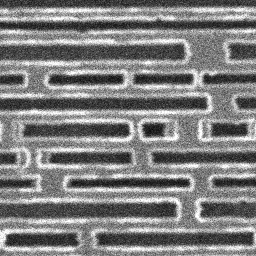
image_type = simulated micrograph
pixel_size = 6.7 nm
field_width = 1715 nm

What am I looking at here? parallel lines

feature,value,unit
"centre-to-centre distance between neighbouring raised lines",0.176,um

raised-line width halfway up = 86.3 nm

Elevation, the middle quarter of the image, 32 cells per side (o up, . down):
oooooooooooooooooooooooooooooooo
oooooooooooooooooooooooooooooooo
ooooooo........oo...............
...............oo...............
...............oo...............
oooooooooooooooooooooooooooooooo
oooooooooooooooooooooooooooooooo
oooooooooooooooooooooooooooooooo
................................
................................
................................
................................
oooooooooooooooooooooooooooooooo
oooooooooooooooooooooooooooooooo
ooo.oooo..oooooooooooooooooooooo
.................ooo......oooooo
.................ooo.....ooooooo
.................ooo.....ooooooo
................oooooooooooooooo
oooooooooooooooooooooooooooooooo
oooooooooooooooooooooooooooooooo
oooooooooooooooooooooooooooooooo
.................ooooo..........
.................ooooo..........
.................ooooo..........
oooooooooooooooooooooooooooooooo
oooooooooooooooooooooooooooooooo
oooooooooooooooooooooooooooooooo
oooooooooooooo.................o
o...............................
o...............................
oooooooooooooooooooooooooooooooo